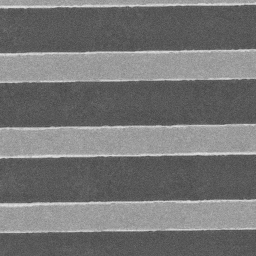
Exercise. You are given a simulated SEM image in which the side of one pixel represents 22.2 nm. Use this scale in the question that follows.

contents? lines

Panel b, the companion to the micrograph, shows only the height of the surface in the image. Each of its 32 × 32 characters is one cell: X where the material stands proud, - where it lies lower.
XXXXXXXXXXXXXXXXXXXXXXXXXXXXXXXX
--------------------------------
--------------------------------
--------------------------------
--------------------------------
--------------------------------
-----------------XXXXXXXXXXXXXXX
XXXXXXXXXXXXXXXXXXXXXXXXXXXXXXXX
XXXXXXXXXXXXXXXXXXXXXXXXXXXXXXXX
XXXXXXXXXXXXXXXXXXXXXXXXXXXXXXXX
--------------------------------
--------------------------------
--------------------------------
--------------------------------
--------------------------------
--------------------------------
XXXXXXXXXXXXXXXXXXXXXXXXXXXXXXXX
XXXXXXXXXXXXXXXXXXXXXXXXXXXXXXXX
XXXXXXXXXXXXXXXXXXXXXXXXXXXXXXXX
XXXXXXXXXXXX--------------------
--------------------------------
--------------------------------
--------------------------------
--------------------------------
--------------------------------
XXXXXXXXXXXXXXXXXXXXXXXXXXXXXXXX
XXXXXXXXXXXXXXXXXXXXXXXXXXXXXXXX
XXXXXXXXXXXXXXXXXXXXXXXXXXXXXXXX
XXXXXXXXXXXXXXXXXXXXXXXXXXXXXXXX
--------------------------------
--------------------------------
--------------------------------